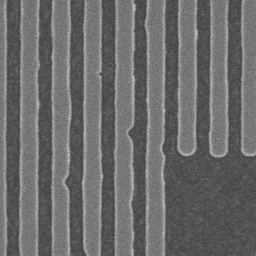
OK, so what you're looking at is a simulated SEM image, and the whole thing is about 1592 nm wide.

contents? parallel lines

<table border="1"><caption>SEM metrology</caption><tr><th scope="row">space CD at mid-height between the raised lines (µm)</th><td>0.0871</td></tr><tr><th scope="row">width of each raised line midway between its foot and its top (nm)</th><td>112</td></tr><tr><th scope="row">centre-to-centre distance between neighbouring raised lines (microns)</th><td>0.197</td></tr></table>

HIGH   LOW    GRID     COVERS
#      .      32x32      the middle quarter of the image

#....####....####....####....###
#....####....####....####....###
#....####....####....####....###
#....####....#####...####....###
#....####....#####...####....###
#....####....####....####....###
#....####....####....####....###
#....####....####....####....###
#....####....####....####....###
##...####....####....####....###
##...####....####....####....###
##...####....####....####....###
##...####....####....####...####
##...####....####....####...####
#....####....####....####....###
#....####....####....####....###
#....####....###.....####....###
#....####....###.....####....###
#....####....####....####...####
#....####....####....####...####
#....####....####....###....####
#....####....####....####....###
#....####....####....####....###
#....####....####....####.......
#....####....####....####.......
#....####....####....####.......
#....####....####....####.......
#....#####...####....####.......
#....#####...####....####.......
....#####....####....####.......
.....####....####....####.......
#....####....####....####.......